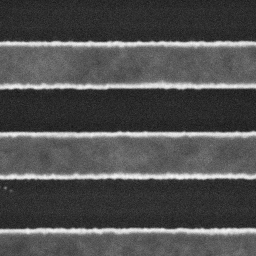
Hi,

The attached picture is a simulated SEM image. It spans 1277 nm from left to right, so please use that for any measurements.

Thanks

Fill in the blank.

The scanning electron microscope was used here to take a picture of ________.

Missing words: lines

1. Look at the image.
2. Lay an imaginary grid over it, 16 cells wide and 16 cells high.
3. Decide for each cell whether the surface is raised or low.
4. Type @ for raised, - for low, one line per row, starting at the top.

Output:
----------------
----------------
----------------
@@@@@@@@@@@@@@@@
@@@@@@@@@@@@@@@@
@@@@@@@---@@@---
----------------
----------------
@@@@@@@@@@@@@@@@
@@@@@@@@@@@@@@@@
@@@@@@@@@@@@@@@@
----------------
----------------
----------------
@@@@@@@@@@@@@@@@
@@@@@@@@@@@@@@@@